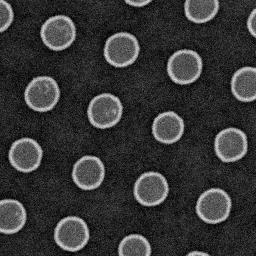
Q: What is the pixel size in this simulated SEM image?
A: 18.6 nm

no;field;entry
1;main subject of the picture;a regular array of raised bodies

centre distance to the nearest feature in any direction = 1180 nanometers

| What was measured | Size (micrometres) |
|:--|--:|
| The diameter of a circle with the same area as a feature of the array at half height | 0.607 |